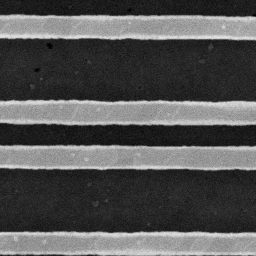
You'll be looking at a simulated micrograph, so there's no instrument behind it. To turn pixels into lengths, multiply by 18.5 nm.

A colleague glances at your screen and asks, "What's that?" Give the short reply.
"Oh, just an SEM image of lines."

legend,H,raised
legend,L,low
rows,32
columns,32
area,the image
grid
LLLLLLLLLLLLLLLLLLLLLLLLLLLLLLLL
LLLLLLLLLLLLLLLLLLLLLLLLLLLLLLLL
HHHHHHHHHHHHHHHHHHHHHHHHHHHHHHHH
HHHHHHHHHHHHHHHHHHHHHHHHHHHHHHHH
HHHHHHHHHHHHHHHHHHHHHHHHHHHHHHHH
LLLLLLLLLLLLLLLLLLLLLLLLLLLLLLLL
LLLLLLLLLLLLLLLLLLLLLLLLLLLLLLLL
LLLLLLLLLLLLLLLLLLLLLLLLLLLLLLLL
LLLLLLLLLLLLLLLLLLLLLLLLLLLLLLLL
LLLLLLLLLLLLLLLLLLLLLLLLLLLLLLLL
LLLLLLLLLLLLLLLLLLLLLLLLLLLLLLLL
LLLLLLLLLLLLLLLLLLLLLLLLLLLLLLLL
LLLLLLLLLLLLLLLLLLLLLLLLLLLLLLLL
HHHHHHHHHHHHHHHHHHHHHHHHHHHHHHHH
HHHHHHHHHHHHHHHHHHHHHHHHHHHHHHHH
LLLLLLLLLLHHLLLLLLLLHHLLLLLLHHHH
LLLLLLLLLLLLLLLLLLLLLLLLLLLLLLLL
LLLLLLLLLLLLLLLLLLLLLLLLLLLLLLLL
HHHHHHHHHHHHHHHHHHHHHHHHHHHHHLLL
HHHHHHHHHHHHHHHHHHHHHHHHHHHHHHHH
HHHHHHHHHHHHHHHHHHHHHHHHHHHHHHHH
LLLLLLLLLLLLLLLLLLLLLLLLLLLLLLLL
LLLLLLLLLLLLLLLLLLLLLLLLLLLLLLLL
LLLLLLLLLLLLLLLLLLLLLLLLLLLLLLLL
LLLLLLLLLLLLLLLLLLLLLLLLLLLLLLLL
LLLLLLLLLLLLLLLLLLLLLLLLLLLLLLLL
LLLLLLLLLLLLLLLLLLLLLLLLLLLLLLLL
LLLLLLLLLLLLLLLLLLLLLLLLLLLLLLLL
LLLLLLLLLLLLLLLLLLLLLLLLLLLLLLLL
HHHHHHHHHHHHHHHHHHHHHHHHHHHHHHHH
HHHHHHHHHHHHHHHHHHHHHHHHHHHHHHHH
HHHHHHHHHHHHHHHHHHHHHHHHHHHHHHHH